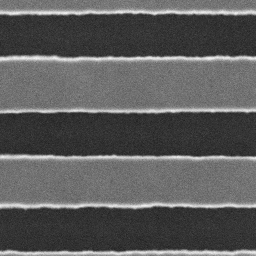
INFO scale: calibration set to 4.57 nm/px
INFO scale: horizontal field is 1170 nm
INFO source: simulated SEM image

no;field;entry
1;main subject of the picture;lines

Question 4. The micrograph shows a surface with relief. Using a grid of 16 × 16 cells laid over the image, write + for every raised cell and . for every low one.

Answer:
++++++++++++++++
................
................
................
++++++++++++++++
++++++++++++++++
++++++++++++++++
................
................
................
++++++++++++++++
++++++++++++++++
++++++++++++++++
................
................
................